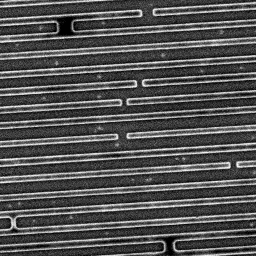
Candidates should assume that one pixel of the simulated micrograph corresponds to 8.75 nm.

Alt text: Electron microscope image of parallel lines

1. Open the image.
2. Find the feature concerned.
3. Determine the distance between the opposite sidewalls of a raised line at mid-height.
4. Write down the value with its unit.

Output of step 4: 55.7 nm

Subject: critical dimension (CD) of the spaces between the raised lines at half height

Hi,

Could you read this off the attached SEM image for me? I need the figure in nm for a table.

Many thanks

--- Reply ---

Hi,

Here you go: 104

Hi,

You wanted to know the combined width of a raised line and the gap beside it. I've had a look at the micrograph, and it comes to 152 nm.